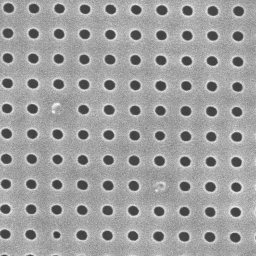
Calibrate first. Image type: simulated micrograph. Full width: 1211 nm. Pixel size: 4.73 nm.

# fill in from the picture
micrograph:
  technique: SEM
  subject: a regular array of holes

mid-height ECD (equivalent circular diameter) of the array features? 0.0498 microns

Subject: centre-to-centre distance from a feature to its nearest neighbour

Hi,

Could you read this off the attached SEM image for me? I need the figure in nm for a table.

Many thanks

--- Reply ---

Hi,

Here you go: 118